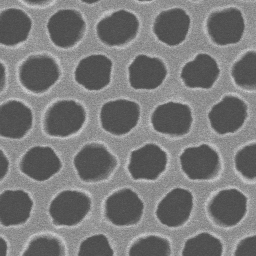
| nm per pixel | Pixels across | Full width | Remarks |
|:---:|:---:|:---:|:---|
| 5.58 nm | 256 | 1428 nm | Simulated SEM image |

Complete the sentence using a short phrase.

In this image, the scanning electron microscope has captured a regular array of holes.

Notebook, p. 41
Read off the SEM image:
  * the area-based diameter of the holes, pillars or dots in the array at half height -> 208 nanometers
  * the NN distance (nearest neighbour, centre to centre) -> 286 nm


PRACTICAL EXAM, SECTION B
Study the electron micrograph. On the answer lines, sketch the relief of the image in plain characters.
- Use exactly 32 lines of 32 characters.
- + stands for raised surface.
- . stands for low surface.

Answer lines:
++++++++++++++++++++++++++++++++
...++++...++++..++++...+++++..++
....++....+++....++.....++....++
....++....++.....++.....++....++
...+++....++.....+++...+++....++
..+++++..++++..++++++.+++++..+++
+++++++++++++++++++++++++++++++.
+++....+++....+++...++++...+++..
.++....++.....++.....++....++...
.+.....++.....++.....++....++...
.++....+++...+++....+++....+++..
++++.+++++++++++++++++++++++++++
+++++++++++++++.++++++++++++..++
...+++....+++....+++....++.....+
....++.....++....++.....++.....+
....++....+++....++.....++....++
...+++...++++...++++...++++..+++
++++++++++++++++++++++++++++++++
++++..++++...++++...++++..+++++.
.++....++.....++.....++....++...
.++.....+......+.....++....++...
.++....+++....++....+++....+++..
++++..++++...++++++++++++.++++++
++++++++++++++++++++++.+++++++++
....+++....+++...++++...+++....+
....++.....++.....++....++.....+
....++.....++.....++....++.....+
...+++....++++...+++...++++...++
++++++++++++++++++++++++++++++++
++++++++++++.+++++++++++..+++++.
.+++...+++....+++....++.....++..
.++.....++....++.....++.....+...